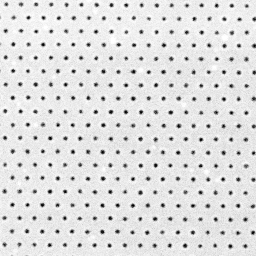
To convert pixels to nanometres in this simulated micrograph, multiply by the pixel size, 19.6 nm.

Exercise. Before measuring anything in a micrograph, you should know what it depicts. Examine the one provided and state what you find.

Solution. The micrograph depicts a regular array of holes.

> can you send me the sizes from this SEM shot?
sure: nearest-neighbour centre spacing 289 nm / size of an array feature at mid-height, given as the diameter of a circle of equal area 106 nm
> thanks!